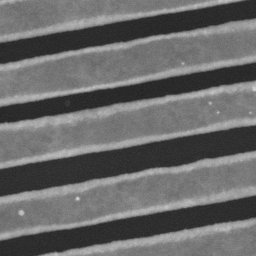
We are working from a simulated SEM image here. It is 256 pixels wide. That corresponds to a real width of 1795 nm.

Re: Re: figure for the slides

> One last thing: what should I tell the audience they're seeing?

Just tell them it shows lines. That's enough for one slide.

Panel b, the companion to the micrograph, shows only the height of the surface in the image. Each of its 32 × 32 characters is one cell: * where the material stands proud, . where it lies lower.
***************************.....
**********************..........
***************.................
**********................******
****...............*************
..............******************
........************************
...*****************************
***************************.....
*********************...........
*****************.............**
**********...............*******
****..............**************
.............*******************
........************************
.*******************************
**************************......
********************............
***************.................
*********....................***
***.....................********
..................**************
.............*******************
.......*************************
..*****************************.
*************************.......
********************............
**************.................*
********.................*******
**..................************
..............******************
........************************